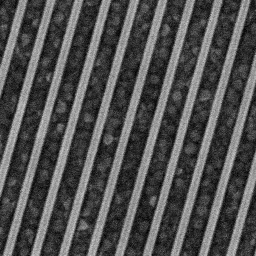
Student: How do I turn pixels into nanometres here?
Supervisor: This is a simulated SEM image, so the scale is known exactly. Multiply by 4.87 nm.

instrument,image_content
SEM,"parallel lines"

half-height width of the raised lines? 36.9 nanometers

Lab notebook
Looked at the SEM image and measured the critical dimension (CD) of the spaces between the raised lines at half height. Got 96.1 nanometres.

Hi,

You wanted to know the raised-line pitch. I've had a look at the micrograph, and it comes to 131 nanometers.